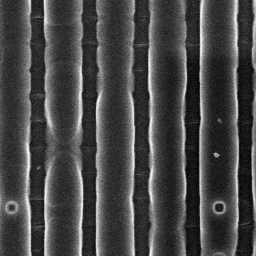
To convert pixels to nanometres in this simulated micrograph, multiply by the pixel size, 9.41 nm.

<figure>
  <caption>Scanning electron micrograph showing wiring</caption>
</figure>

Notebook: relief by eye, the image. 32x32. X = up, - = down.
XXXX--XXXX--XXXXX--XXXX--XXXXX--
XXXX--XXXX--XXXXX--XXXX--XXXXX--
XXXX--XXXX--XXXX---XXXX--XXXXX--
XXXX--XXXX--XXXXX--XXXX--XXXXX--
XXXX--XXXX--XXXX---XXXX--XXXXX--
XXXX--XXXX---XXX---XXXX--XXXXX--
XXXX--XXXX--XXXX---XXXX--XXXXX--
XXXX--XXXX--XXXX---XXXX--XXXXX--
XXXX--XXXX--XXXX---XXXX--XXXXX--
XXXX--XXXX--XXXX---XXXX--XXXX---
XXXX--XXXX--XXXX---XXXX--XXXXX--
XXXX--XXXX--XXXX---XXXX--XXXXX--
XXXX--XXXX--XXXXX--XXXX--XXXXX--
XXXX--XXXX--XXXXX--XXXX--XXXXX--
XXXX--XXXX--XXXXX--XXXX--XXXXX--
XXXX--XXXX--XXXXX--XXXX--XXXXX--
XXXX--XXXX--XXXXX--XXXX--XXXXX--
XXX---XXXX--XXXXX--XXXX--XXXXX--
XXXX--XXXX--XXXXX--XXXX--XXXXX--
XXXX--XXXX--XXXXX--XXXX--XXXXX--
XXXX--XXXX--XXXXX--XXXX--XXXXX--
XXXX--XXXX--XXXXX--XXXX--XXXXX--
XXXX--XXXX--XXXXX--XXXX--XXXXX--
XXXX--XXXX--XXXXX--XXXX--XXXXX--
XXXX--XXXX--XXXX---XXXX--XXXXX--
XXXX--XXXX--XXXXX--XXXX--XX-XX--
XXXX--XXXX--XXXXX--XXXX--XXXXX--
XXXX--XXXX--XXXXX--XXXX--XXXXX--
XXXX--XXXX--XXXXX--XXXX--XXXXX--
XXXX--XXXX--XXXXX--XXXX--XXXXX--
XXXX--XXXX--XXXXX--XXXX--XXXXX--
XXXX--XXXX--XXXXX--XXXX--XXXX---